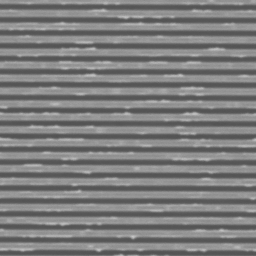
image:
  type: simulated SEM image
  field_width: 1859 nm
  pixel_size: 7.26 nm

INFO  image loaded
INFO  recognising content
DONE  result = parallel lines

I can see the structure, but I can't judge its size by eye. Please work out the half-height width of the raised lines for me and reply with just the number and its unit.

51.7 nanometers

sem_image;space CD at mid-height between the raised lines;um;0.039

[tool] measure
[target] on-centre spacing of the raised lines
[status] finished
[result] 93.9 nm